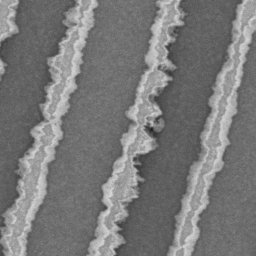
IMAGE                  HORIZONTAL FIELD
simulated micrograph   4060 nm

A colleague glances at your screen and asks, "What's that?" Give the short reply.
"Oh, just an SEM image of one or a few lines or trenches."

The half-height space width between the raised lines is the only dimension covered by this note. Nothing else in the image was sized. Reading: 0.972 micrometres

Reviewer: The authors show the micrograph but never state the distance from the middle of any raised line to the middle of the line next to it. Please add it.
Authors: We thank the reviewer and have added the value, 1290 nanometres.